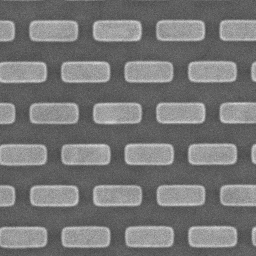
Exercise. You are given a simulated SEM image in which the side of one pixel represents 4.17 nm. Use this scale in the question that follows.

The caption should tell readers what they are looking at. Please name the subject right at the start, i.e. groups of lines, slits or small figures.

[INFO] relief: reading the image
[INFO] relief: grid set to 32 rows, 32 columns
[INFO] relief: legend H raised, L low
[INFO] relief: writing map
LLLLLLLLLLLLLLLLLLLLLLLLLLLLLLLL
LLLLLLLLLLLLLLLLLLLLLLLLLLLLLLLL
LLLLLLLLLLLLLLLLLLLLLLLLLLLLLLLL
HHLLHHHHHHLLHHHHHHLLHHHHHHLLHHHH
HHLLHHHHHHLLHHHHHHLLHHHHHHLLHHHH
LLLLLLLLLLLLLLLLLLLLLLLLLLLLLLLL
LLLLLLLLLLLLLLLLLLLLLLLLLLLLLLLL
LLLLLLLLLLLLLLLLLLLLLLLLLLLLLLLL
HHHHHHLLHHHHHHLLHHHHHHLLHHHHHHLH
HHHHHHLLHHHHHHLLHHHHHHLLHHHHHHLH
LLLLLLLLLLLLLLLLLLLLLLLLLLLLLLLL
LLLLLLLLLLLLLLLLLLLLLLLLLLLLLLLL
LLLLLLLLLLLLLLLLLLLLLLLLLLLLLLLL
HHLLHHHHHHLLHHHHHHLLHHHHHHLLHHHH
HHLLHHHHHHLLHHHHHHLLHHHHHHLLHHHH
LLLLLLLLLLLLLLLLLLLLLLLLLLLLLLLL
LLLLLLLLLLLLLLLLLLLLLLLLLLLLLLLL
LLLLLLLLLLLLLLLLLLLLLLLLLLLLLLLL
HHHHHHLLHHHHHHLLHHHHHLLLHHHHHLLL
HHHHHHLLHHHHHHLLHHHHHHLLHHHHHHLL
HHHHHLLLHHHHHLLLHHHHHLLLHHHHHLLL
LLLLLLLLLLLLLLLLLLLLLLLLLLLLLLLL
LLLLLLLLLLLLLLLLLLLLLLLLLLLLLLLL
HHLLHHHHHHLLHHHHHLLLHHHHHLLLHHHH
HHLLHHHHHHLLHHHHHHLLHHHHHHLLHHHH
HLLLHHHHHLLLHHHHHLLLHHHHHLLLHHHH
LLLLLLLLLLLLLLLLLLLLLLLLLLLLLLLL
LLLLLLLLLLLLLLLLLLLLLLLLLLLLLLLL
HHHHHLLLHHHHHLLLHHHHHLLLHHHHHLLL
HHHHHHLLHHHHHHLLHHHHHHLLHHHHHHLL
HHHHHHLLHHHHHHLLHHHHHLLLHHHHHLLL
LLLLLLLLLLLLLLLLLLLLLLLLLLLLLLLL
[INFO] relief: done